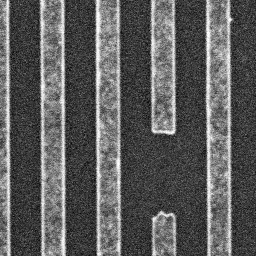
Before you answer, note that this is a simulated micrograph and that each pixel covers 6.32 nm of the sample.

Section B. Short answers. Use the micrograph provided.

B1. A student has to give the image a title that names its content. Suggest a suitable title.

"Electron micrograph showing parallel lines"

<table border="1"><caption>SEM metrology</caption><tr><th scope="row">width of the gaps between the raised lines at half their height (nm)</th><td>214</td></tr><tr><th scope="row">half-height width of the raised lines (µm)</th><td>0.139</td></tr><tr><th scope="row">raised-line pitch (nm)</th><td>349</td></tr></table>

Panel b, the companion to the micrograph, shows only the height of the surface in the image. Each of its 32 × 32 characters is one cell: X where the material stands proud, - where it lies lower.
X----XXX----XXX----XXX----XXX---
X----XXX----XXX----XXX----XXX---
X----XXX----XXX----XXX----XXX---
X----XXX----XXX----XXX----XXX---
X----XXX----XXX----XXX----XXX---
X----XXX----XXX----XXX----XXX---
X----XXX----XXX----XXX----XXX---
X----XXX----XXX----XXX----XXX---
X----XXX----XXX----XXX----XXX---
X----XXX----XXX----XXX----XXX---
X----XXX----XXX----XXX----XXX---
X----XXX----XXX----XXX----XXX---
X----XXX----XXX----XXX----XXX---
X----XXX----XXX----XXX----XXX---
X----XXX----XXX----XXX----XXX---
X----XXX----XXX----XXX----XXX---
X----XXX----XXX-----------XXX---
X----XXX----XXX-----------XXX---
X----XXX----XXX-----------XXX---
X----XXX----XXX-----------XXX---
X----XXX----XXX-----------XXX---
X----XXX----XXX-----------XXX---
X----XXX----XXX-----------XXX---
X----XXX----XXX-----------XXX---
X----XXX----XXX-----------XXX---
X----XXX----XXX-----------XXX---
X----XXX----XXX-----------XXX---
X----XXX----XXX----XXX----XXX---
X----XXX----XXX----XXX----XXX---
X----XXX----XXX----XXX----XXX---
X----XXX----XXX----XXX----XXX---
X----XXX----XXX----XXX----XXX---